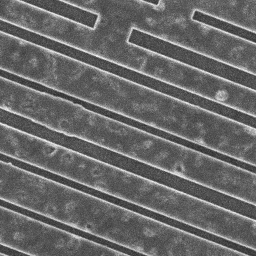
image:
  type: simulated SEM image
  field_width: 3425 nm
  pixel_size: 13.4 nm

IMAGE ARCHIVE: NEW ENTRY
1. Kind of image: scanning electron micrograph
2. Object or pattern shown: parallel lines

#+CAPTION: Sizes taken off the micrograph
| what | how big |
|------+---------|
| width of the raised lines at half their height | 29.1 pixels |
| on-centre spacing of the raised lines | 0.547 um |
